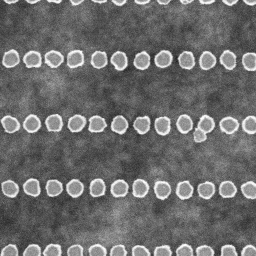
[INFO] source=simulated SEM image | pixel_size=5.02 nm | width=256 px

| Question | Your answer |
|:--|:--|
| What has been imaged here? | a regular array of raised bodies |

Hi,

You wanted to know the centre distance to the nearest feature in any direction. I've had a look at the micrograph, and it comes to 106 nm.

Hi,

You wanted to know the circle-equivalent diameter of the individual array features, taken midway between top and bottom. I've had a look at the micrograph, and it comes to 81.4 nm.